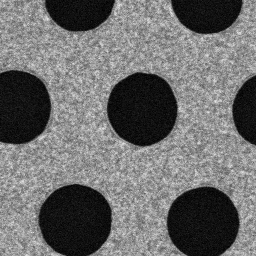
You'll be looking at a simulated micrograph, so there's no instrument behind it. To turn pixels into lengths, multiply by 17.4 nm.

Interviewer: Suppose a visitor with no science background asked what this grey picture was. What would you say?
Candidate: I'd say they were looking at holes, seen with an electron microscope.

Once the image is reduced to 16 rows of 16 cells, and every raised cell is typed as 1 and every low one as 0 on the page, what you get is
1110000111100001
1111001111100001
1111111111111111
1111111111111111
0011111111111111
0001111000011110
0001111000011110
0001111000011110
0011111000111110
1111111111111111
1111111111111111
1111111111111111
1110000111100011
1100000111000001
1110000111100001
1110001111100011